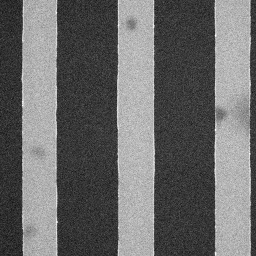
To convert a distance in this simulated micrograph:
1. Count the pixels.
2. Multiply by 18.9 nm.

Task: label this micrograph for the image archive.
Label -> one or a few lines or trenches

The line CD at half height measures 657 nm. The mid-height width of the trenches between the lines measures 61.6 pixels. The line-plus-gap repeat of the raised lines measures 1820 nm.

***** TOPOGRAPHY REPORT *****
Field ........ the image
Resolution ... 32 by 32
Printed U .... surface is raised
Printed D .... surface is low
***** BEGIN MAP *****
DDDUUUUDDDDDDDDUUUUDDDDDDDDUUUUD
DDDUUUUDDDDDDDDUUUUDDDDDDDDUUUUD
DDDUUUUDDDDDDDDUUUUDDDDDDDDUUUUD
DDDUUUUDDDDDDDDUUUUDDDDDDDDUUUUD
DDDUUUUDDDDDDDDUUUUDDDDDDDDUUUUD
DDDUUUUDDDDDDDDUUUUDDDDDDDDUUUUD
DDDUUUUDDDDDDDDUUUUDDDDDDDDUUUUD
DDDUUUUDDDDDDDDUUUUDDDDDDDDUUUUD
DDDUUUUDDDDDDDDUUUUDDDDDDDDUUUUD
DDDUUUUDDDDDDDDUUUUDDDDDDDDUUUUD
DDDUUUUDDDDDDDDUUUUDDDDDDDDUUUUD
DDDUUUUDDDDDDDDUUUUDDDDDDDDUUUUD
DDDUUUUDDDDDDDDUUUUDDDDDDDDUUUUD
DDDUUUUDDDDDDDDUUUUDDDDDDDDUUUUD
DDDUUUUDDDDDDDDUUUUDDDDDDDDUUUUD
DDDUUUUDDDDDDDDUUUUDDDDDDDDUUUUD
DDDUUUUDDDDDDDDUUUUDDDDDDDDUUUUD
DDDUUUUDDDDDDDDUUUUDDDDDDDDUUUUD
DDDUUUUDDDDDDDDUUUUDDDDDDDDUUUUD
DDDUUUUDDDDDDDDUUUUDDDDDDDDUUUUD
DDDUUUUDDDDDDDDUUUUDDDDDDDDUUUUD
DDDUUUUDDDDDDDDUUUUDDDDDDDDUUUUD
DDDUUUUDDDDDDDDUUUUDDDDDDDDUUUUD
DDDUUUUDDDDDDDDUUUUDDDDDDDDUUUUD
DDDUUUUDDDDDDDDUUUUDDDDDDDDUUUUD
DDDUUUUDDDDDDDDUUUUDDDDDDDDUUUUD
DDDUUUUDDDDDDDDUUUUDDDDDDDDUUUUD
DDDUUUUDDDDDDDDUUUUDDDDDDDDUUUUD
DDDUUUUDDDDDDDDUUUUDDDDDDDDUUUUD
DDDUUUUDDDDDDDDUUUUDDDDDDDDUUUUD
DDDUUUUDDDDDDDDUUUUDDDDDDDDUUUUD
DDDUUUUDDDDDDDDUUUUDDDDDDDDUUUUD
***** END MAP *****